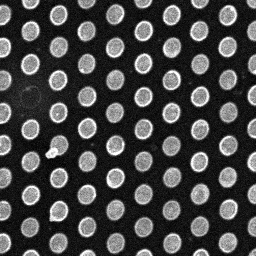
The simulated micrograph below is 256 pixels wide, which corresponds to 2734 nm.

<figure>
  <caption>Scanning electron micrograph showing a regular array of raised bodies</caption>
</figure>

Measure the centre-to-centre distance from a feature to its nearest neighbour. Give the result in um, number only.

0.342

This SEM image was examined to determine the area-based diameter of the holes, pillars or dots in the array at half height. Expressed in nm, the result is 201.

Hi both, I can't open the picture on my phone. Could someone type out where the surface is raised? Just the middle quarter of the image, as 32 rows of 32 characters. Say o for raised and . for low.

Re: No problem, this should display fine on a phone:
....oooo..........oooo..........
....ooo...........ooo...........
...........oooo..........oooo...
o..........oooo..........oooo...
o..........oooo..........oooo...
...........ooo...........oooo...
....ooo............oo...........
....oooo..........oooo..........
....oooo..........oooo..........
....oooo..........oooo..........
.....o.....ooo.....o......oo....
o..........oooo..........oooo...
o..........oooo..........oooo...
...........ooo...........oooo...
....ooo.....o......ooo....oo....
....oooo..........oooo..........
....oooo..........oooo..........
....oooo..........oooo..........
.....o......oo.....oo.....oo....
o..........oooo..........oooo...
o..........oooo..........oooo...
o..........oooo..........oooo...
.....oo.....oo.....oo....ooo....
....oooo..........oooo..........
....oooo..........oooo..........
....oooo..........oooo..........
.....oo.....oo.....oo.....ooo...
o..........oooo..........oooo...
o..........oooo..........oooo...
o..........oooo..........oooo...
.....oo....ooo.....oo.....oo....
....oooo..........oooo..........